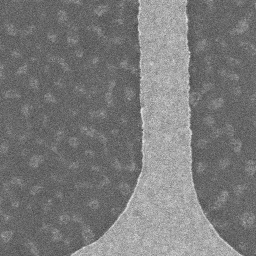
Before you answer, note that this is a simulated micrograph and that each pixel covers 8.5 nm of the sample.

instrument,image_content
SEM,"one or a few lines or trenches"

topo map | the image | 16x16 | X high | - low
---------XXX----
---------XXX----
---------XXX----
---------XXX----
---------XXX----
---------XXX----
---------XXX----
---------XXX----
---------XXX----
---------XXX----
---------XXX----
---------XXX----
--------XXXX----
--------XXXXX---
-------XXXXXXX--
-----XXXXXXXXXX-